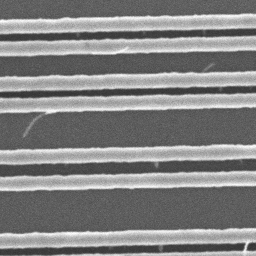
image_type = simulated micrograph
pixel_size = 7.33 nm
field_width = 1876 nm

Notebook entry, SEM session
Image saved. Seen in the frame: lines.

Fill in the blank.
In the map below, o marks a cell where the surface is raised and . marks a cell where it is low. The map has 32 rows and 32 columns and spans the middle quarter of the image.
................................
................................
.......................ooooooooo
oooooooooooooooooooooooooooooooo
oooooooooooooooooooooooooooooooo
oooooooooooooooooooooooooooooooo
................................
................................
oooooooooooooooooooooooooooooooo
oooooooooooooooooooooooooooooooo
oooooooooooooooooooooooooooooooo
oooooooooooooo..................
................................
................................
................................
................................
................................
................................
................................
................................
................................
oooooooooooooooooooooooooooooooo
oooooooooooooooooooooooooooooooo
oooooooooooooooooooooooooooooooo
ooooo...........................
................................
................................
.....................ooooooooooo
oooooooooooooooooooooooooooooooo
oooooooooooooooooooooooooooooooo
oooooooooooooooooooooooooooooooo
................................